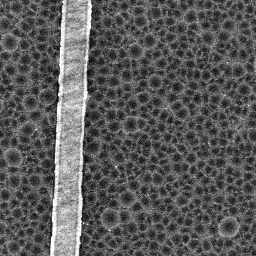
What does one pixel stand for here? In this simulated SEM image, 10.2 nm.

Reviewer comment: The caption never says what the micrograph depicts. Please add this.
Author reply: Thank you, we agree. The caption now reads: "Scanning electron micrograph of one or a few lines or trenches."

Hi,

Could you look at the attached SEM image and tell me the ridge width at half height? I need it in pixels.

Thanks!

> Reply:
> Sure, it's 25.9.